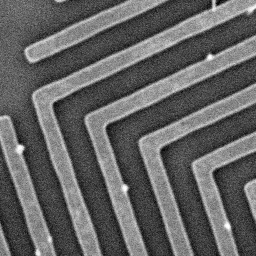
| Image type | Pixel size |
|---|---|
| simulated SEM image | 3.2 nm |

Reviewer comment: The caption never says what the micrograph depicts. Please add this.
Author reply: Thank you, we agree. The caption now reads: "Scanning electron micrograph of groups of lines, slits or small figures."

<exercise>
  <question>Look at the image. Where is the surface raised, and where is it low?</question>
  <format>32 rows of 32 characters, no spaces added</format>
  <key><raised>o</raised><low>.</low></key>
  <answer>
...............ooooo........oooo
.............ooooo........ooooo.
...........oooo........ooooo....
.........oooo.........oooo......
.......oooo........ooooo........
....ooooo........ooooo........oo
...oooo........ooooo........oooo
....o........oooo........ooooo..
...........oooo........ooooo....
.........oooo........ooooo......
......ooooo........ooooo........
....ooooo........ooooo........oo
....ooo........ooooo........oooo
.....o.......ooooo........oooo..
.....oo....ooooo........oooo....
o....oo....ooo........oooo......
oo....o....oo......ooooo........
oo....oo...ooo....oooo........oo
ooo...oo....oo....oo........oooo
.oo...ooo...oo....oo......oooo..
.oo....oo...ooo...oo....oooo....
.oo....oo....oo....oo...ooo.....
..oo...ooo...oo....oo....oo.....
..oo....oo....oo...oo....oo....o
..oo....oo....oo....oo...oo....o
...oo...ooo...oo....oo....oo...o
...oo....oo....oo...oo....oo....
...ooo...oo....oo...ooo...oo....
....oo...ooo...oo....oo....oo...
....oo....oo...ooo...oo....oo...
o...oo....oo....oo...ooo...oo...
o....oo...oo....oo....oo....oo..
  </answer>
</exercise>